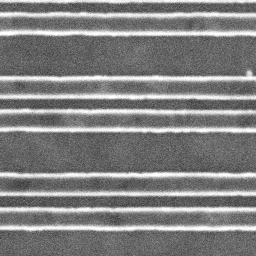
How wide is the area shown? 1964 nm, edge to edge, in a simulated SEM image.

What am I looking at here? lines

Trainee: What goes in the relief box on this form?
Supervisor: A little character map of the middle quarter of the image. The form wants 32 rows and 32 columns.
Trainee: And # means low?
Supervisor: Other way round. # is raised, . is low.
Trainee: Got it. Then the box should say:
................................
................................
................................
.##########################..##.
################################
################################
################################
################################
................................
................................
................................
................................
################################
################################
################################
################################
################################
................................
................................
................................
................................
................................
................................
................................
................................
................................
................................
.##...######....##...###########
################################
################################
################################
################################